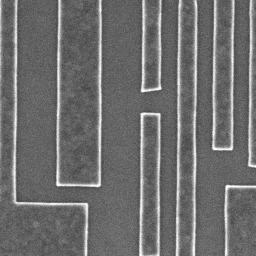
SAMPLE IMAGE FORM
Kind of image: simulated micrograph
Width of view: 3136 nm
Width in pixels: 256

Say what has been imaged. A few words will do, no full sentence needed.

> wiring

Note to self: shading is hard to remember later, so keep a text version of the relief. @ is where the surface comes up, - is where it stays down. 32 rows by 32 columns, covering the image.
@@-----@@@@@@-----@@--@@@--@@--@
@@-----@@@@@@-----@@--@@@--@@--@
@@-----@@@@@@-----@@--@@@--@@--@
@@-----@@@@@@-----@@--@@@--@@--@
@@-----@@@@@@-----@@--@@@--@@--@
@@-----@@@@@@-----@@--@@@--@@--@
@@-----@@@@@@-----@@--@@@--@@--@
@@-----@@@@@@-----@@--@@@--@@--@
@@-----@@@@@@-----@@--@@---@@--@
@@-----@@@@@@-----@@--@@---@@--@
@@-----@@@@@------@@--@@---@@--@
@@-----@@@@@@---------@@---@@--@
@@-----@@@@@@---------@@---@@--@
@@-----@@@@@@---------@@---@@--@
@@-----@@@@@@-----@@--@@---@@--@
@@-----@@@@@@-----@@--@@---@@--@
@@-----@@@@@------@@--@@---@@--@
@@-----@@@@@------@@--@@---@@--@
@@-----@@@@@------@@--@@---@@--@
@@-----@@@@@------@@--@@-------@
@@-----@@@@@------@@--@@-------@
@@-----@@@@@------@@--@@--------
@@-----@@@@@------@@--@@--------
@@----------------@@--@@----@@@@
@@----------------@@--@@----@@@@
@@@@@@------------@@--@@----@@@@
@@@@@@@@@@@-------@@--@@----@@@@
@@@@@@@@@@@-------@@--@@----@@@@
@@@@@@@@@@@-------@@--@@----@@@@
@@@@@@@@@@@-------@@--@@----@@@@
@@@@@@@@@@@-------@@--@@----@@@@
@@@@@@@@@@@-------@@--@@----@@@@